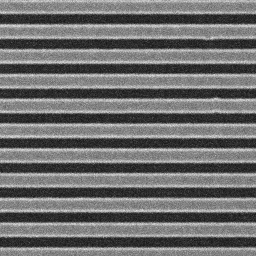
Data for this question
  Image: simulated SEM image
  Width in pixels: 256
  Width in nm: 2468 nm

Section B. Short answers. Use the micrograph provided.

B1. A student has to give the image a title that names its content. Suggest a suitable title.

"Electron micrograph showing parallel lines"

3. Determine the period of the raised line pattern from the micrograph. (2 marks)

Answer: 238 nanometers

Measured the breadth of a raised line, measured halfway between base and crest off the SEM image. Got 13 pixels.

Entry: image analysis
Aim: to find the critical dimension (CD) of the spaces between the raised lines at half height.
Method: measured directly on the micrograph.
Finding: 117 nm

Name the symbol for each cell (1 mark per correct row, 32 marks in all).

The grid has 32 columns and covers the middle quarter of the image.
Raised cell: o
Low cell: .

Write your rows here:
................................
................................
................................
oooooooooooooooooooooooooooooooo
oooooooooooooooooooooooooooooooo
oooooooooooooooooooooooooooooooo
................................
................................
................................
oooooooooooooooooooooooooooooooo
oooooooooooooooooooooooooooooooo
oooooooooooooooooooooooooooooooo
................................
................................
................................
oooooooooooooooooooooooooooooooo
oooooooooooooooooooooooooooooooo
oooooooooooooooooooooooooooooooo
................................
................................
................................
oooooooooooooooooooooooooooooooo
oooooooooooooooooooooooooooooooo
oooooooooooooooooooooooooooooooo
o............o......o..oo...o...
................................
................................
................................
oooooooooooooooooooooooooooooooo
oooooooooooooooooooooooooooooooo
oooooooooooooooooooooooooooooooo
................................